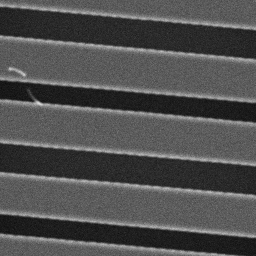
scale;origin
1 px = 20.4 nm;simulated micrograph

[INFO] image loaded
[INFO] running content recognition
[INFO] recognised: lines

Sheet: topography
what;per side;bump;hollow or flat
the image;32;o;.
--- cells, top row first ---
oooooooooooooooooooooooooooooooo
........oooooooooooooooooooooooo
...................ooooooooooooo
..............................oo
................................
ooooooooooo.....................
oooooooooooooooooooooo..........
oooooooooooooooooooooooooooooooo
oooooooooooooooooooooooooooooooo
oooooooooooooooooooooooooooooooo
......oooooooooooooooooooooooooo
..................oooooooooooooo
............................oooo
oooooooooooo....................
oooooooooooooooooooooo..........
oooooooooooooooooooooooooooooooo
oooooooooooooooooooooooooooooooo
oooooooooooooooooooooooooooooooo
........oooooooooooooooooooooooo
..................oooooooooooooo
..............................oo
................................
oooooooooo......................
oooooooooooooooooooooo..........
oooooooooooooooooooooooooooooooo
oooooooooooooooooooooooooooooooo
oooooooooooooooooooooooooooooooo
........oooooooooooooooooooooooo
...................ooooooooooooo
oo...........................ooo
oooooooooooooo..................
oooooooooooooooooooooooo........